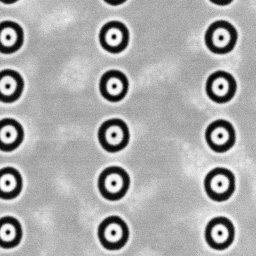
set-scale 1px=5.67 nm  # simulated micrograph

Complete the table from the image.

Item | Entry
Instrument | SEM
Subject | a regular array of ring-shaped grooves with a dot in the middle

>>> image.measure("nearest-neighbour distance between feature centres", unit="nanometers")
276